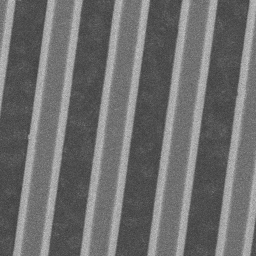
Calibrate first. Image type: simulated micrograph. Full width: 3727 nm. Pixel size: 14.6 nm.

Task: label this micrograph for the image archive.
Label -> one or a few lines or trenches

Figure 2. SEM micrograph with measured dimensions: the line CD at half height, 393 nm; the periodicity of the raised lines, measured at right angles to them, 973 nanometres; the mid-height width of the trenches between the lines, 575 nm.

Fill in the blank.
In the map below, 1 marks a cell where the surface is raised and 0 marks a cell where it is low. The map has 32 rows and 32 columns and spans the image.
10000011110000011100000111100000
10000011110000011100000111100000
10000011110000011100000111000001
10000011100000111100000111000001
10000011100000111100000111000001
10000011100000111000000111000001
10000011100000111000001111000001
00000111100000111000001111000001
00000111100000111000001111000001
00000111100000111000001110000011
00000111000001111000001110000011
00000111000001111000001110000011
00000111000001111000001110000011
00000111000001110000011110000011
00001111000001110000011110000011
00001111000001110000011110000011
00001111000001110000011100000111
00001110000011110000011100000111
00001110000011110000011100000111
00001110000011110000011100000111
00001110000011100000111100000111
00001110000011100000111100000111
00011110000011100000111100000111
00011110000011100000111100000111
00011110000011100000111000001111
00011100000111100000111000001111
00011100000111100000111000001111
00011100000111100000111000001110
00011100000111000001111000001110
00111100000111000001111000001110
00111100000111000001111000001110
00111100000111000001110000011110